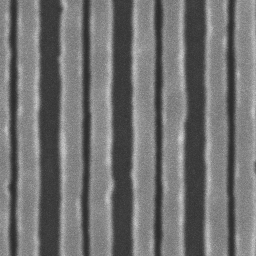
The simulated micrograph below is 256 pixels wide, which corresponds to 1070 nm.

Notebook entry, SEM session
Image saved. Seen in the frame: parallel lines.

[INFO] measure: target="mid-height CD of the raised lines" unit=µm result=0.088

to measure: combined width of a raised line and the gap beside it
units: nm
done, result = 157